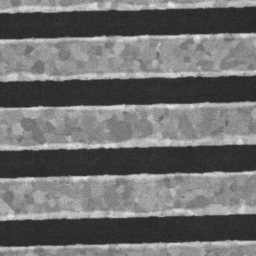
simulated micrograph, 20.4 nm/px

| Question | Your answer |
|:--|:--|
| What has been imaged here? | lines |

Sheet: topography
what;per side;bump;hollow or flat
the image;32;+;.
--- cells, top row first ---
++++++++++++++++++++++++++++++++
................................
................................
................................
.......................+++++++++
++++++++++++++++++++++++++++++++
++++++++++++++++++++++++++++++++
++++++++++++++++++++++++++++++++
++++++++++++++++++++++++++++++++
+++++++++++++...................
................................
................................
................................
.....+++++++++++++++++++++++++++
++++++++++++++++++++++++++++++++
++++++++++++++++++++++++++++++++
++++++++++++++++++++++++++++++++
++++++++++++++++++++++++++++++++
+++++...........................
................................
................................
................................
++++++++++++++++++++++++++++++++
++++++++++++++++++++++++++++++++
++++++++++++++++++++++++++++++++
++++++++++++++++++++++++++++++++
+++++++++++++++++++++++++.......
................................
................................
................................
....................++++++++++++
++++++++++++++++++++++++++++++++